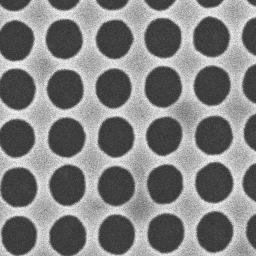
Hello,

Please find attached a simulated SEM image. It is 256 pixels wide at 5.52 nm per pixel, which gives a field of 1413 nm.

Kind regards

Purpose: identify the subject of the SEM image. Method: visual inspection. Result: a regular array of holes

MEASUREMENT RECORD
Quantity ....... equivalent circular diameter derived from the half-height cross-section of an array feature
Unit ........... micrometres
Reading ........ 0.215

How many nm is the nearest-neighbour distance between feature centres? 267